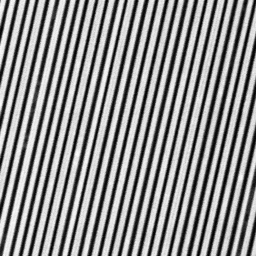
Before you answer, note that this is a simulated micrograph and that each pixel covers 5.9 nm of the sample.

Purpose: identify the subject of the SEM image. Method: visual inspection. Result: parallel lines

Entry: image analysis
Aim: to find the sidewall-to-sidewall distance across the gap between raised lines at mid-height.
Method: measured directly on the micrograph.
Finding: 26.6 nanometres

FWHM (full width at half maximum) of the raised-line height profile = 32.4 nm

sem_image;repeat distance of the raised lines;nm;57